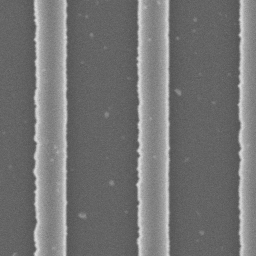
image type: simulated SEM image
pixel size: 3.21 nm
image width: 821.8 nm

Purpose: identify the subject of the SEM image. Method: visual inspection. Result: lines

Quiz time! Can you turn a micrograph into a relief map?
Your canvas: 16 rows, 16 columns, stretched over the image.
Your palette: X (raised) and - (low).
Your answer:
--XX-----XX----X
--XX-----XX----X
--XX-----XX----X
--XX-----XX----X
--XX-----XX----X
--XX-----XX----X
--XX-----XX----X
--XX-----XX----X
--XX-----XX----X
--XX-----XX----X
--XX-----XX----X
--XX-----XX----X
--XX-----XX----X
--XX-----XX----X
--XX-----XX----X
--XX-----XX----X